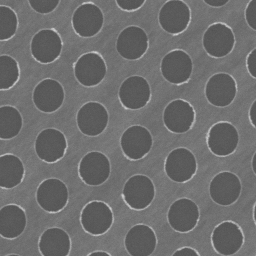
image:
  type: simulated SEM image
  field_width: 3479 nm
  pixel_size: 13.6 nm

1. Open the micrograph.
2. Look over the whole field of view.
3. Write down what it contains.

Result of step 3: a regular array of holes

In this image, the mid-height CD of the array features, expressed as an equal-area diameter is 440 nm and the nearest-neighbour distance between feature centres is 0.669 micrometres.